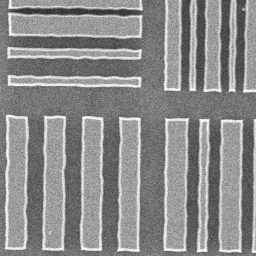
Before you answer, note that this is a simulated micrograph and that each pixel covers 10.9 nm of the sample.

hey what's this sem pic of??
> groups of lines, slits or small figures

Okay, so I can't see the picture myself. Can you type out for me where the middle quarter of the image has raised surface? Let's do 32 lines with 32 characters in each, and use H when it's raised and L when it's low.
LLLLLLLLLLLLLLLLLLLLLLLLLHHHHLLL
LLLLLLLLLLLLLLLLLLLLLLLLLHHHHLLL
LLLLLLLLLLLLLLLLLLLLLLLLLHHHHLLL
HHHHHHHHHHHHHHHLHHHLLLLLLHHHHLLL
HHHHHHHHHHHHHHHHHHHLLLLLLHHHHLLL
LLLLLLLLLLLLLLLLLLLLLLLLLHHHHLLL
LLLLLLLLLLLLLLLLLLLLLLLLLLLLLLLL
LLLLLLLLLLLLLLLLLLLLLLLLLLLLLLLL
LLLLLLLLLLLLLLLLLLLLLLLLLLLLLLLL
LLLLLLLLLLLLLLLLLLLLLLLLLLLLLLLL
LLLLLLLLLLLLLLLLLLLLLLLLLLLLLLLL
LLLLLLLLLLLLLLLLLLLLLLLLLLLLLLLL
LLLLLLLLLLLLLLLLLLLLLLLLLLLLLLLL
LLLLLHHHLLLLLLLLLLLLLLLLLLLLLLLL
LLLLLHHHHHLLLLHHHHHLLLLLLLHHHHHL
LLLLLHHHHHLLLLHHHHHLLLLLLLHHHHHL
LLLLLHHHHLLLLLHHHHHLLLLLLLHHHHHL
LLLLLHHHHHLLLLHHHHHLLLLLLLHHHHHL
LLLLLHHHHHLLLLHHHHHLLLLLLLHHHHHL
LLLLLHHHHLLLLLHHHHHLLLLLLLHHHHHL
LLLLLHHHHLLLLLHHHHHLLLLLLLHHHHHL
LLLLLHHHHLLLLLHHHHHLLLLLLLHHHHHL
LLLLLHHHHLLLLLHHHHHLLLLLLLHHHHHL
LLLLLHHHHLLLLLHHHHHLLLLLLLHHHHHL
LLLLLHHHHLLLLLHHHHHLLLLLLLHHHHHL
LLLLLHHHHLLLLLHHHHHLLLLLLLHHHHHL
LLLLLHHHHLLLLLHHHHHLLLLLLHHHHHHL
LLLLHHHHHLLLLLHHHHHLLLLLLHHHHHHL
LLLLHHHHHLLLLLHHHHHLLLLLLHHHHHLL
LLLLHHHHHHLLLLHHHHHLLLLLLHHHHHHL
LLLLHHHHHLLLLLHHHHHLLLLLLHHHHHHL
LLLLHHHHHLLLLLHHHHHLLLLLLLHHHHHL